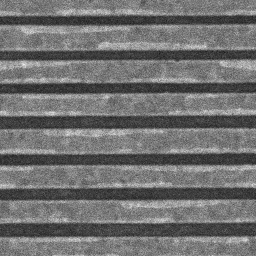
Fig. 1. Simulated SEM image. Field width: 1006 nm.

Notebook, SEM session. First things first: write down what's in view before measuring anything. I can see parallel lines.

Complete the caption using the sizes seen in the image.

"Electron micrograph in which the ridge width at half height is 86.4 nm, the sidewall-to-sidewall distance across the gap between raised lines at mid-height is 48.1 nm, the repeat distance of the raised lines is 136 nm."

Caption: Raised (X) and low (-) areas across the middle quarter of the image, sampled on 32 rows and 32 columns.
XXXXXXXXXXXXXXXXXXXXXXXXXXXXXXXX
XXXXXXXXXXXXXXXXXXXXXXXXXXXXXXXX
XXXXXXXXXXXXXXXXXXXXXXXXXXXXXXXX
XXXXXXXXXXXXXXXXXXXXXXXXXXXXXXXX
------------------------XXXXXXXX
--------------------------------
--------------------------------
-------------------------XX-----
XXXXXXXXXXXXXXXXXXXXXXXXXXXXXXXX
XXXXXXXXXXXXXXXXXXXXXXXXXXXXXXXX
XXXXXXXXXXXXXXXXXXXXXXXXXXXXXXXX
XXXXXXXXXXXXXXXXXXXXXXXXXXXXXXXX
XXXXXXXXXXXXXXXXXXXXXXXX--XXXX-X
--------------------------------
--------------------------------
--------------------------------
XXXXXXX-----------XXXXXXXXX-----
XXXXXXXXXXXXXXXXXXXXXXXXXXXXXXXX
XXXXXXXXXXXXXXXXXXXXXXXXXXXXXXXX
XXXXXXXXXXXXXXXXXXXXXXXXXXXXXXXX
XXXXXXXXXXXXXXXXXXXXXXXXXXXXXXXX
XXXXXXXXXXXXXXXXXXXXXXXXXXXXXXXX
--------------------------------
--------------------------------
--------------------------------
--------------------------------
XXXXXXXXXXXXXXXXXXXXXXXXXXXXXXXX
XXXXXXXXXXXXXXXXXXXXXXXXXXXXXXXX
XXXXXXXXXXXXXXXXXXXXXXXXXXXXXXXX
XXXXXXXXXXXXXXXXXXXXXXXXXXXXXXXX
XXXXXXXXXXXXXXXXXXXXXXXXXXXXXXXX
--------------------------------